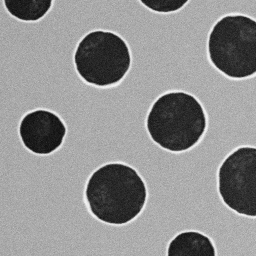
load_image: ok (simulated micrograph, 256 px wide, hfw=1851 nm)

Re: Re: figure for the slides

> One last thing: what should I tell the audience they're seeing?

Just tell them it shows holes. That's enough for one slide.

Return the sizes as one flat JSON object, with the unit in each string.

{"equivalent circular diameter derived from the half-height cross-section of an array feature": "409 nm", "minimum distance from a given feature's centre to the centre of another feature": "684 nm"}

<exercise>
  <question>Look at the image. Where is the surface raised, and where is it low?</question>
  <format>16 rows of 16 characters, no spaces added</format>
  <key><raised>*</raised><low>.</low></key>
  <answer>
...******..*****
**************..
*****...*****...
*****...*****...
*****...******..
****************
**********..****
*...*****....***
*...*****....***
**.************.
******..******..
******...*****..
*****....*****..
******..********
****************
***********..***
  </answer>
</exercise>